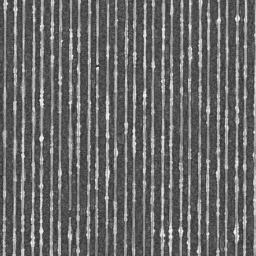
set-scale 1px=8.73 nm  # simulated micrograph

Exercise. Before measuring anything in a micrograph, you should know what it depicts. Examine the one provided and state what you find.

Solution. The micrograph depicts parallel lines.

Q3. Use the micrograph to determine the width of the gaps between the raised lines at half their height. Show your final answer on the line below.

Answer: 6.75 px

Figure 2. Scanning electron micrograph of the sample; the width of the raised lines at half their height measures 16.4 nm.